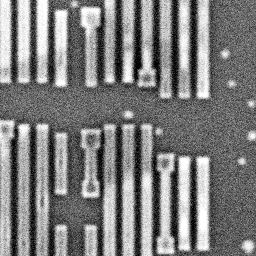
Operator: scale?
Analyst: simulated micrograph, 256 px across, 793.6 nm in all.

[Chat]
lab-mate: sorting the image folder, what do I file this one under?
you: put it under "wiring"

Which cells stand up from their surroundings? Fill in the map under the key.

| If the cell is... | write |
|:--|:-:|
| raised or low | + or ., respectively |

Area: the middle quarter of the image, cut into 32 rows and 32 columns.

......++..++...++...++..+++..++.
......++..++...++..++++.+++..++.
......++..++...++..++++.+++..++.
......++..++...++..++++.+++..++.
......++...........++++.+++..++.
........................+++..++.
........................+++..++.
........................+++..++.
................................
................................
................................
................................
................................
................................
................................
..........+++..++...++..........
..........+++..++...++..........
.....++++.+++..++...++..........
.....++++.+++..++...++..........
.....++++.+++..++...++..........
.....++++.+++..++...++..........
.....+++..+++..++...++..........
......++..+++..++...++..........
......++..+++..++...++..+++.....
......++..+++..++...++..+++..++.
......++..+++..++...++..+++..++.
......++..+++..++...++..+++..++.
......++..+++..++...++..++...++.
......++..+++..++...++..++...++.
.....++++.+++..++...++..++...++.
.....++++.+++..++...++..++...++.
.....++++.+++..++...++..++...++.